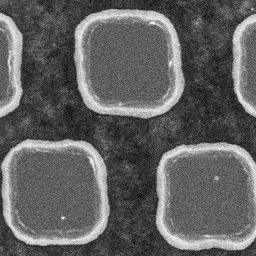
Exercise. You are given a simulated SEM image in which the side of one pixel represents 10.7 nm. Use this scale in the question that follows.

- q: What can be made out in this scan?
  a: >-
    raised bodies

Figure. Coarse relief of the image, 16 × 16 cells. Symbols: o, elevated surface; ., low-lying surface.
................
o....oooooo....o
o....oooooo....o
o....oooooo....o
o....oooooo....o
o....oooooo....o
o.....ooooo....o
................
................
.ooooo.....oooo.
oooooo....oooooo
oooooo....oooooo
ooooooo...oooooo
ooooooo...oooooo
.ooooo....oooooo
................